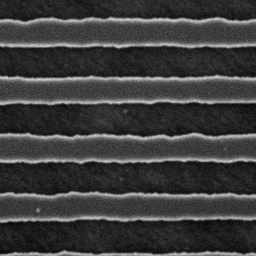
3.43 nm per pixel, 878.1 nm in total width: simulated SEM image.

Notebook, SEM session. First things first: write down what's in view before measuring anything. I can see lines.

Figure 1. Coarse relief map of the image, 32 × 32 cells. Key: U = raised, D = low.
DDDDDDDDDDDDDDDDDDDDDDDDDDDDDDDD
DDDDDDDDDDDDDDDDDDDDDDDDDDDDDDDD
UUDDUUUUUUUUUUUUUUUUUUUUDUUUUDDU
UUUUUUUUUUUUUUUUUUUUUUUUUUUUUUUU
UUUUUUUUUUUUUUUUUUUUUUUUUUUUUUUU
UUUUUUUUUUUUUUUUUUUUUUUUUUUUUUUU
DDDDDDDDDDDDDDDDDDDDDDDDDDDDDDDD
DDDDDDDDDDDDDDDDDDDDDDDDDDDDDDDD
DDDDDDDDDDDDDDDDDDDDDDDDDDDDDDDD
DDDDDDDDDDDDDDDDDDDDDDDDDDDUDDDD
UUUUUUUUUUUUUUUUUUUUUUUUUUUUUUUU
UUUUUUUUUUUUUUUUUUUUUUUUUUUUUUUU
UUUUUUUUUUUUUUUUUUUUUUUUUUUUUUUU
DDDDDDDDDDDDDDDDDDDDDDDDDDDDDDDD
DDDDDDDDDDDDDDDDDDDDDDDDDDDDDDDD
DDDDDDDDDDDDDDDDDDDDDDDDDDDDDDDD
DDDDDDDDDDDDDDDDDDDDDDDDDDDDDDDD
UUUUUUUUUUUUUUUUUUUUUUUUUUUUUUUU
UUUUUUUUUUUUUUUUUUUUUUUUUUUUUUUU
UUUUUUUUUUUUUUUUUUUUUUUUUUUUUUUU
DDDDDDDDDDDDDDDDDDDDDDDDDDDDDDDD
DDDDDDDDDDDDDDDDDDDDDDDDDDDDDDDD
DDDDDDDDDDDDDDDDDDDDDDDDDDDDDDDD
DDDDDDDDDDDDDDDDDDDDDDDDDDDDDDDD
UUUUUUDUUUUUUUUUUUUUUUUUUUUUUUUU
UUUUUUUUUUUUUUUUUUUUUUUUUUUUUUUU
UUUUUUUUUUUUUUUUUUUUUUUUUUUUUUUU
UUUUUUUUUDDDDDDUDDDDDDDDDDDDDDDD
DDDDDDDDDDDDDDDDDDDDDDDDDDDDDDDD
DDDDDDDDDDDDDDDDDDDDDDDDDDDDDDDD
DDDDDDDDDDDDDDDDDDDDDDDDDDDDDDDD
DDDDDDDDUDDDDDDDDDDDDDDDDUUUDDDD